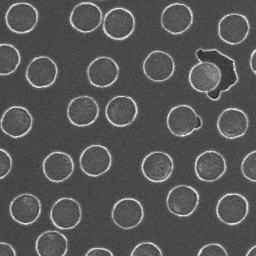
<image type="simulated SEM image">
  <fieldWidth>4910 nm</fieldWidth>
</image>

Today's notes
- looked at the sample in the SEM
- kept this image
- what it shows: a regular array of holes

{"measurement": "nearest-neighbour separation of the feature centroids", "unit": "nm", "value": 838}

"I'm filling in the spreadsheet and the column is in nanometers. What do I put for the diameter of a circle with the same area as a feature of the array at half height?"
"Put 551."